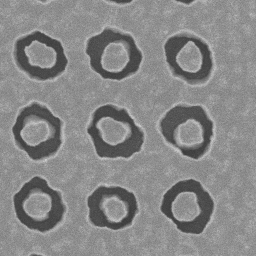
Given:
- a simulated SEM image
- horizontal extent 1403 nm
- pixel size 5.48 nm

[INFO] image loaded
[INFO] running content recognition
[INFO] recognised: a regular array of ring-shaped grooves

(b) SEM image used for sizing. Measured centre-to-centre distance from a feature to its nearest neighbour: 395 nanometres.